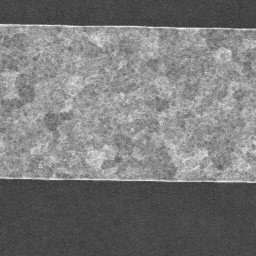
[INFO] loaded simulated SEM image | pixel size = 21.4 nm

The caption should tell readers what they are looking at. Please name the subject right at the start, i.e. wiring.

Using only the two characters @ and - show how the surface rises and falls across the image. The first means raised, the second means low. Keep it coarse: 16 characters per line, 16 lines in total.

----------------
----------------
@@@@@@@@@@@@@@@@
@@@@@@@@@@@@@@@@
@@@@@@@@@@@@@@@@
@@@@@@@@@@@@@@@@
@@@@@@@@@@@@@@@@
@@@@@@@@@@@@@@@@
@@@@@@@@@@@@@@@@
@@@@@@@@@@@@@@@@
@@@@@@@@@@@@@@@@
----------------
----------------
----------------
----------------
----------------